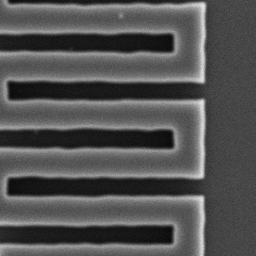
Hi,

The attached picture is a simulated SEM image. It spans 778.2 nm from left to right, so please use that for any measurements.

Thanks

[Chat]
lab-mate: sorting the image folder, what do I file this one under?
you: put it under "groups of lines, slits or small figures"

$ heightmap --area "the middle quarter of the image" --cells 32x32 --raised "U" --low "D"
UUUUUUUUUUUUUUUUUUUUUUUUUUUUUUUU
UUUUUUUUUUUUUUUUUUUUUUUUUUUUUUUU
UUUUUUUUUUUUUUUUUUUUUUUUUUUUUUUU
UUUUUUUUUUUUUUUUUUUUUUUUUUUUUUUU
DDDDDDDDDDDDUUUUUUDDDUUUUDDDDDDD
DDDDDDDDDDDDDDDDDDDDDDDDDDDDDDDD
DDDDDDDDDDDDDDDDDDDDDDDDDDDDDDDD
DDDDDDDDDDDDDDDDDDDDDDDDDDDDDDDD
DDDDDDDDDDDDDDDDDDDDDDDDDDDDDDDD
UUUUUUUUUUUUUUUUUUUUUUUUUUUUUUUU
UUUUUUUUUUUUUUUUUUUUUUUUUUUUUUUU
UUUUUUUUUUUUUUUUUUUUUUUUUUUUUUUU
UUUUUUUUUUUUUUUUUUUUUUUUUUUUUUUU
UUUUUUUUUUUUUUUUUUUUUUUUUUUUUUUU
UUUUUUUUUUUUUUUUUUUUUUUUUUUUUUUU
UUUUUUUUUUUUUUUUUUUUUUUUUUUUUUUU
DDDDDDDDDDDDDDDDDDDDDDDDDDDUUUUU
DDDDDDDDDDDDDDDDDDDDDDDDDDDDUUUU
DDDDDDDDDDDDDDDDDDDDDDDDDDDDUUUU
DDDDDDDDDDDDDDDDDDDDDDDDDDDDUUUU
DDDDDDDDDDDDDDDDDDDDDDDDDDDDUUUU
UDUUUUUUUUUUUUUUUUUUUUUUUUUUUUUU
UUUUUUUUUUUUUUUUUUUUUUUUUUUUUUUU
UUUUUUUUUUUUUUUUUUUUUUUUUUUUUUUU
UUUUUUUUUUUUUUUUUUUUUUUUUUUUUUUU
UUUUUUUUUUUUUUUUUUUUUUUUUUUUUUUU
UUUUUUUUUUUUUUUUUUUUUUUUUUUUUUUU
UUUUUUUUUUUUUUUUUUUUUUUUUUUUUUUU
DDDDDDDDDDDDDDDDDDDDDDDDDDDDDDDD
DDDDDDDDDDDDDDDDDDDDDDDDDDDDDDDD
DDDDDDDDDDDDDDDDDDDDDDDDDDDDDDDD
DDDDDDDDDDDDDDDDDDDDDDDDDDDDDDDD